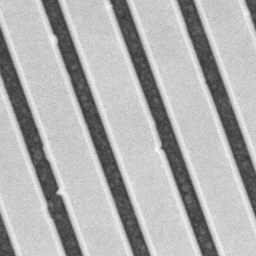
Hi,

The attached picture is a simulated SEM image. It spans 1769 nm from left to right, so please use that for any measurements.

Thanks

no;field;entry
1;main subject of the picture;one or a few lines or trenches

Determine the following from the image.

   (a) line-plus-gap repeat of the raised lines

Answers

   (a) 440 nanometers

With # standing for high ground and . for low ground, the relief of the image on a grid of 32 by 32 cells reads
#####...######..######...#####..
#####...######...#####...######.
######...#####...######..######.
######...######..######...#####.
.######..######...#####...######
.######...#####...######...#####
..#####...######..######...#####
..######..######...#####...#####
..######...#####...######...####
...#####...######...#####...####
...######..######...#####...####
...######...######..######...###
#...#####...######...#####...###
#...######...#####...######..###
##..######...######..######...##
##...#####...######...#####...##
##...######...#####...######...#
###...#####...######..######...#
###...#####...######...#####...#
###...######...#####...######...
####...#####...######...#####...
####...######..######...######..
####...######...#####...######..
#####...#####...######...#####..
#####...######..######...######.
#####...######...######..######.
######...#####...######...#####.
.#####...######...#####...######
.######..######...######..######
..#####...#####...######...#####
..#####...######...#####...#####
..######...#####...######...####